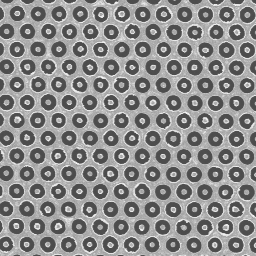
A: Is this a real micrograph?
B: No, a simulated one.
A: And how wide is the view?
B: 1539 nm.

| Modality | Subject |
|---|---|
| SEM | a regular array of ring-shaped grooves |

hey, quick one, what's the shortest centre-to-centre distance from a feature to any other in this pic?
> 0.122 microns